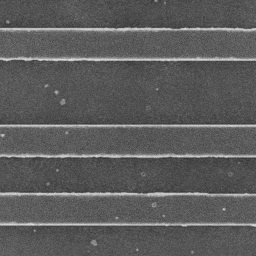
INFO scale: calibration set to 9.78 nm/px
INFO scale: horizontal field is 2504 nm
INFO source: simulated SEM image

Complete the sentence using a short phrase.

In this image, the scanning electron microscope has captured lines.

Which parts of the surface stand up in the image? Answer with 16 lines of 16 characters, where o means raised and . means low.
................
................
oooooooooooooooo
oooooooooooooooo
................
................
................
................
oooooooooooooooo
oooooooooooooooo
................
................
oooooooooooooooo
oooooooooooooooo
................
................